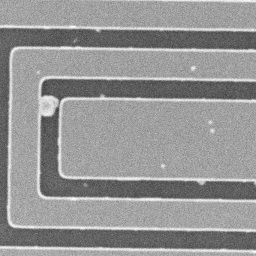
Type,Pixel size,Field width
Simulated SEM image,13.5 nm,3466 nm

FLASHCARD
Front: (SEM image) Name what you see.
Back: groups of lines, slits or small figures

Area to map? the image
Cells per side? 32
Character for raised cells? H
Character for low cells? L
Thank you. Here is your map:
HHHHHHHHHHHHHHHHHHHHHHHHHHHHHHHH
HHHHHHHHHHHHHHHHHHHHHHHHHHHHHHHH
HHHHHHHHHHHHHHHHHHHHHHHHHHHHHHHH
LLLLLLLLLLLLLLHHHHHHHHHHHHHHHHHH
LLLLLLLLLLLLLLLLLLLLLLLLLLLLLLLL
LLLLLLLLLLLLLLLLLLLLLLLLLLLLLLLL
LLHHHHHHHHHHHHHHHHHHHHHHHHHHHHHH
LHHHHHHHHHHHHHHHHHHHHHHHHHHHHHHH
LHHHHHHHHHHHHHHHHHHHHHHHHHHHHHHH
LHHHHHHHHHHHHHHHHHHHHHHHHHHHHHHH
LHHHHLLLLLLLLLLLLLLLLLLLLLLLLLLL
LHHHHLLLLLLLLLLLLLLLLLLLLLLLLLLL
LHHHHHHLHHHHHHHHHHHHHHHHHLLLLLLL
LHHHHHHLHHHHHHHHHHHHHHHHHHHHHHHH
LHHHHLLLHHHHHHHHHHHHHHHHHHHHHHHH
LHHHHLLLHHHHHHHHHHHHHHHHHHHHHHHH
LHHHHLLLHHHHHHHHHHHHHHHHHHHHHHHH
LHHHHLLLHHHHHHHHHHHHHHHHHHHHHHHH
LHHHHLLLHHHHHHHHHHHHHHHHHHHHHHHH
LHHHHLLLHHHHHHHHHHHHHHHHHHHHHHHH
LHHHHLLLHHHHHHHHHHHHHHHHHHHHHHHH
LHHHHLLLHHHHHHHHHHHHHHHHHHHHHHHH
LHHHHLLLLLLLLLLLLLLLLLLLLLLLLLLL
LHHHHLLLLLLLLLLLLLLLLLLLLLLLLLLL
LHHHHLLLLLLLLLLLLLLLLLLLLLLLLLLL
LHHHHHHHHHHHHHHHHHHHHHHHHHHHHHHH
LHHHHHHHHHHHHHHHHHHHHHHHHHHHHHHH
LHHHHHHHHHHHHHHHHHHHHHHHHHHHHHHH
LLLLLLLLLLLHHHHHHHHHHHHHHHHHHHHH
LLLLLLLLLLLLLLLLLLLLLLLLLLLLLLLL
LLLLLLLLLLLLLLLLLLLLLLLLLLLLLLLL
HHHHHHHHHHHHHHHHHHHHHHHHHHHHHHHH